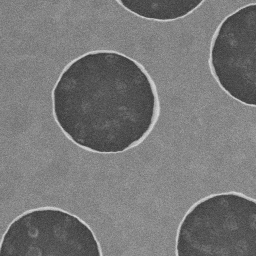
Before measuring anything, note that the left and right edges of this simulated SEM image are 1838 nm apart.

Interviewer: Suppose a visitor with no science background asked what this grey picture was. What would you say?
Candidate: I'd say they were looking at holes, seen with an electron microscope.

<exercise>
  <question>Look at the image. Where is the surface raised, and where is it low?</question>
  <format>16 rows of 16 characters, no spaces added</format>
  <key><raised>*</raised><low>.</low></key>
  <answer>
********....***.
**************..
*************...
*****...*****...
****.....****...
***......*****..
***.......******
****......******
****.....*******
****************
****************
****************
*************...
*...********....
......*****.....
......*****.....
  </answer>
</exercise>